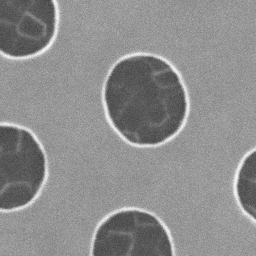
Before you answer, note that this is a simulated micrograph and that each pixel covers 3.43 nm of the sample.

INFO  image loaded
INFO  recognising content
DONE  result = holes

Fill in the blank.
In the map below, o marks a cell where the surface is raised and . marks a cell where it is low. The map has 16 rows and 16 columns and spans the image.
....oooooooooooo
....oooooooooooo
...ooooooooooooo
o.oooooo..oooooo
ooooooo....ooooo
ooooooo.....oooo
ooooooo.....oooo
ooooooo.....oooo
..oooooo...ooooo
...ooooooooooooo
...oooooooooooo.
...oooooooooooo.
..ooooooooooooo.
ooooooo...oooooo
oooooo....oooooo
oooooo.....ooooo